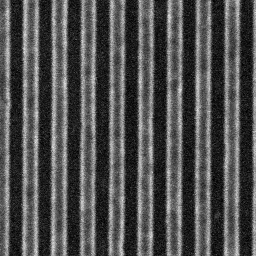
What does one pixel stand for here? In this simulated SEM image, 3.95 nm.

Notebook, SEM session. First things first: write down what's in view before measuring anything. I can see parallel lines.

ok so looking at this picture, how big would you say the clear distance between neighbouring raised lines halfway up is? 63.7 nanometres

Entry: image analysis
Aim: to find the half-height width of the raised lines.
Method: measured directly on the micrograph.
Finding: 49.4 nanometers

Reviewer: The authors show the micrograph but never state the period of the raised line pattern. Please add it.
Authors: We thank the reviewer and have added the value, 114 nm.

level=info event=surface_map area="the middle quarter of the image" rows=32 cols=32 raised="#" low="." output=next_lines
.....###....###....###....###...
.....###....###....###....###...
.....###....###....###....###...
.....###....###....###....###...
.....###....###....###....###...
.....###....###....###....###...
.....###....###....###....###...
.....###....###....###....###...
.....###....###....###....###...
.....###....###....###....###...
.....###....###....###....###...
.....###....###....###....###...
.....##.....###....###....###...
.....##.....###....###....###...
.....##.....###....###....###...
.....##.....###....###....###...
.....##.....###....###....###...
.....##.....###....###....###...
.....##.....###....###....###...
.....##.....###....###....###...
.....##.....###....###....###...
.....##.....###....###....###...
.....##.....###....###....###...
.....##.....###....###....###...
.....##.....###....###....###...
.....##.....###....###....###...
.....##.....###....###....###...
.....##.....###....###....###...
.....##.....###....###....###...
.....##.....###....###....###...
.....##.....###....###....###...
.....##.....###....###....###...